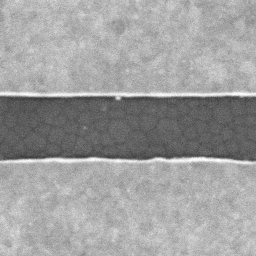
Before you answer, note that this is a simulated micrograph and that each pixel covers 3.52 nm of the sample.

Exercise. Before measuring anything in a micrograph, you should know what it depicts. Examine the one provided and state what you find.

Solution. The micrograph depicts one or a few lines or trenches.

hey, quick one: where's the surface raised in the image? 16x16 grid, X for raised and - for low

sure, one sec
XXXXXXXXXXXXXXXX
XXXXXXXXXXXXXXXX
XXXXXXXXXXXXXXXX
XXXXXXXXXXXXXXXX
XXXXXXXXXXXXXXXX
XXXXXXXXXXXXXXXX
----------------
----------------
----------------
----------------
XXXXXXXXXXXXXXXX
XXXXXXXXXXXXXXXX
XXXXXXXXXXXXXXXX
XXXXXXXXXXXXXXXX
XXXXXXXXXXXXXXXX
XXXXXXXXXXXXXXXX